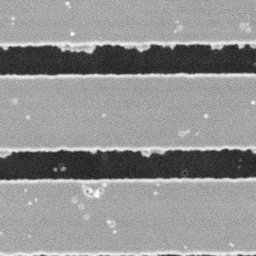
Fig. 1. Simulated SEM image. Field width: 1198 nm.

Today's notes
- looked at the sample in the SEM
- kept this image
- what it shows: lines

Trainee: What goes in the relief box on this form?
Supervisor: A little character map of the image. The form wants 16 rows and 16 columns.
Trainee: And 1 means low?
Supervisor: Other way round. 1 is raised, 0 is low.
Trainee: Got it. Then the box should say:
1111111111111111
1111111111111111
1111111111111111
0000000000000000
0000000000000000
1111111111111111
1111111111111111
1111111111111111
1111111111111111
0000000000000000
0000000000000000
1111111111111111
1111111111111111
1111111111111111
1111111111111111
1111111111111111